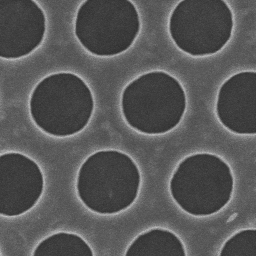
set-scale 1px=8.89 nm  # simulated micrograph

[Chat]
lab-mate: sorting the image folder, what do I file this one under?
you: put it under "holes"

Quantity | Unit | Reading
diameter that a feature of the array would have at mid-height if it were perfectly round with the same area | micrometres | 0.56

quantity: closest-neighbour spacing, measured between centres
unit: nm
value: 806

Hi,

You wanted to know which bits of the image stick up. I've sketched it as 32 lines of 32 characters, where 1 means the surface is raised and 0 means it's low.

00001111110000001111110000001111
00000111110000000111110000000111
00000011110000000111100000000111
00000011100000000111100000000111
00000011110000000111100000000111
00000111110000001111110000001111
00001111111000011111111000011111
11111111111111111111111111111111
11111111111111111111111111111111
11111100011111111100011111111000
11111000000111110000001111110000
11110000000111100000000111100000
11110000000011100000000111100000
11110000000011100000000111100000
11110000000111110000000111100000
11110000000111110000001111110000
11111100001111111100011111111000
11111111111111111111111111111111
11111111111111111111111111111111
00011111111000001111111100011111
00000111110000000111110000001111
00000111110000000111110000000111
00000111110000000111100000000111
00000111110000000111100000000111
00000111110000000111110000000111
00001111111000001111110000001111
00011111111100011111111000011111
11111111111111111111111111111111
11111111111111111111111111111111
11111100001111111000001111111000
11111000000111110000000111110000
11110000000011110000000111110000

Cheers